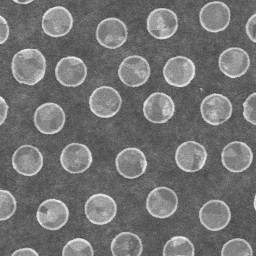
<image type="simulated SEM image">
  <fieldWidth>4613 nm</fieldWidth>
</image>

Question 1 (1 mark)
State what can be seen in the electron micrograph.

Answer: a regular array of raised bodies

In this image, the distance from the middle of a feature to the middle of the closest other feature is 863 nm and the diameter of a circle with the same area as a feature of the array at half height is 530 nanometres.